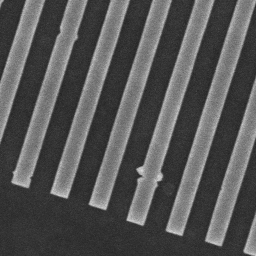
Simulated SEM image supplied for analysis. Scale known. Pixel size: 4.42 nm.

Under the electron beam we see parallel lines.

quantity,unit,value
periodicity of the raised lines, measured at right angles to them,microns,0.178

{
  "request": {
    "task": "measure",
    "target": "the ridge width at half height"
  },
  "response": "78.1 nm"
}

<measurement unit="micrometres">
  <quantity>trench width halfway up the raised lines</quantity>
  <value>0.0991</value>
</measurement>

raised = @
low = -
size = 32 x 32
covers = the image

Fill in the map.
---@@---@@@---@@---@@---@@@---@@
---@@---@@@--@@@---@@---@@---@@@
---@@---@@---@@---@@@---@@---@@-
--@@@---@@---@@---@@---@@@---@@-
--@@---@@@---@@---@@---@@---@@@-
--@@---@@---@@@--@@@---@@---@@--
-@@@---@@---@@---@@---@@@---@@--
-@@---@@@---@@---@@---@@---@@@--
-@@---@@---@@@--@@@---@@---@@---
@@@---@@---@@---@@---@@@---@@---
@@---@@@---@@---@@---@@---@@@---
@@---@@---@@@--@@@---@@---@@---@
@@---@@---@@---@@@---@@---@@---@
@---@@@---@@---@@---@@---@@@---@
@---@@---@@@---@@---@@---@@@---@
@---@@---@@---@@@---@@---@@---@@
---@@@---@@---@@---@@@---@@---@@
---@@---@@@---@@---@@---@@----@@
---@@---@@---@@@---@@---@@---@@@
--@@@---@@---@@---@@@---@@---@@-
--@@---@@@---@@---@@---@@@---@@-
--@@---@@---@@@--@@@---@@---@@@-
--@@---@@---@@---@@@---@@---@@--
-------@@---@@---@@---@@@---@@--
-------@----@@---@@---@@---@@@--
-----------@@---@@@---@@---@@---
----------------@@---@@@---@@---
----------------@@---@@---@@@---
---------------------@@---@@---@
--------------------------@@---@
---------------------------@---@
-------------------------------@